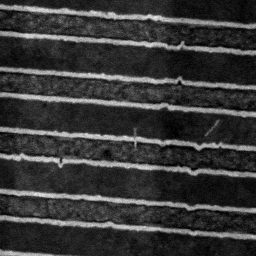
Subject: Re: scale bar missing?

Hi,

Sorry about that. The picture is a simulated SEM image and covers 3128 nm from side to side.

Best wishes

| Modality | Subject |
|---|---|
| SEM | parallel lines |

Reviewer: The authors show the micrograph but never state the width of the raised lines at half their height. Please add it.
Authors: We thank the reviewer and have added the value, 430 nanometres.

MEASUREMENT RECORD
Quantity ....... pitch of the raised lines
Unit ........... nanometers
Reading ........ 748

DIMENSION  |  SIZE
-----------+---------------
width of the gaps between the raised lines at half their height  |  320 nm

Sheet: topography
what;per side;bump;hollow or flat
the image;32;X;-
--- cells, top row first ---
XXXXXXXXXXXXXXXXXXXXXXXXXXXXXXXX
---------XXXXXXXXXXXXXXXXXXXXXXX
--------------------XXXXXXXXXXXX
--------------------------------
XXX-XX--------------------------
XXXXXXXXXXXXXXXXXX--------------
XXXXXXXXXXXXXXXXXXXXXXXXXXXXXX--
XXXXXXXXXXXXXXXXXXXXXXXXXXXXXXXX
XXXXXXXXXXXXXXXXXXXXXXXXXXXXXXXX
------------XXXXXXXXXXXXXXXXXXXX
-------------------------XXXXXXX
--------------------------------
XXXXXXXX------------------------
XXXXXXXXXXXXXXXXXXXXXXX---------
XXXXXXXXXXXXXXXXXXXXXXXXXXXXXXXX
XXXXXXXXXXXXXXXXXXXXXXXXXXXXXXXX
----XXXXXXXXXXXXXXXXXXXXXXXXXXXX
-----------------XXXXXXXXXXXXXXX
------------------------------XX
--------------------------------
XXXXXXXXXXXXX-------------------
XXXXXXXXXXXXXXXXXXXXXXXX-X------
XXXXXXXXXXXXXXXXXXXXXXXXXXXXXXXX
XXXXXXXXXXXXXXXXXXXXXXXXXXXXXXXX
-------XXXXXXXXXXXXXXXXXXXXXXXXX
--------------------XXXXXXXXXXXX
--------------------------------
XXXXX---------------------------
XXXXXXXXXXXXXXXXX---------------
XXXXXXXXXXXXXXXXXXXXXXXXXXXXX---
XXXXXXXXXXXXXXXXXXXXXXXXXXXXXXXX
XXXXXXXXXXXXXXXXXXXXXXXXXXXXXXXX